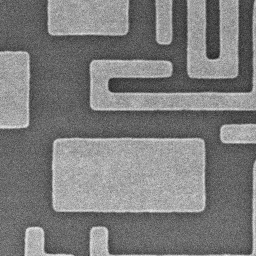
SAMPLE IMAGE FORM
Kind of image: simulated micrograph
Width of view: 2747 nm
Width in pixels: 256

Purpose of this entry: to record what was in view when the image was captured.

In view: wiring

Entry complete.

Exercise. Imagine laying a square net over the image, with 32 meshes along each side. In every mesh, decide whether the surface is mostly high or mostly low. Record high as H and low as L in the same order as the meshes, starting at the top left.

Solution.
LLLLLLHHHHHHHHHHLLLLHLLLHHLLHHLL
LLLLLLHHHHHHHHHHLLLLHLLLHHLLHHLL
LLLLLLHHHHHHHHHHLLLLHLLLHHLLHHLL
LLLLLLHHHHHHHHHHLLLLHLLLHHLLHHLL
LLLLLLLLLLLLLLLLLLLLHLLLHHLLHHLL
LLLLLLLLLLLLLLLLLLLLLLLLHHLLHHLL
LLLLLLLLLLLLLLLLLLLLLLLLHHLLHHLL
HHHHLLLLLLLLLLLLLLLLLLLLHHHHHHLL
HHHHLLLLLLLHHHHHHHHHHLLLHHHHHHLL
HHHHLLLLLLLHHHHHHHHHHLLLHHHHHLLL
HHHHLLLLLLLHHLLLLLLLLLLLLLLLLLLL
HHHHLLLLLLLHHHLLLLLLLLLLLLLLLLLH
HHHLLLLLLLLHHHHHHHHHHHHHHHHHHHHH
HHHLLLLLLLLLHHHHHHHHHHHHHHHHHHHH
HHHLLLLLLLLLLLLLLLLLLLLLLLLLLLLL
HHHLLLLLLLLLLLLLLLLLLLLLLLLLLLLL
LLLLLLLLLLLLLLLLLLLLLLLLLLLLHHHH
LLLLLLLHHHHHHHHHHHHHHHHHHLLLHHHH
LLLLLLLHHHHHHHHHHHHHHHHHHHLLLLLL
LLLLLLLHHHHHHHHHHHHHHHHHHHLLLLLL
LLLLLLLHHHHHHHHHHHHHHHHHHHLLLLLL
LLLLLLLHHHHHHHHHHHHHHHHHHLLLLLLL
LLLLLLLHHHHHHHHHHHHHHHHHHLLLLLLL
LLLLLLLHHHHHHHHHHHHHHHHHHHLLLLLL
LLLLLLLHHHHHHHHHHHHHHHHHHHLLLLLL
LLLLLLLHHHHHHHHHHHHHHHHHHHLLLLLL
LLLLLLLLLLLLLLLLLLLLLLLLLLLLLLLL
LLLLLLLLLLLLLLLLLLLLLLLLLLLLLLLL
LLLLHLLLLLLLHLLLLLLLLLLLLLLLLLLL
LLLHHLLLLLLHHLLLLLLLLLLLLLLLLLLL
LLLHHLLLLLLHHLLLLLLLLLLLLLLLLLLL
LLLHHHLLLLLHHHLLLLLLLLLLLLLLLLLL